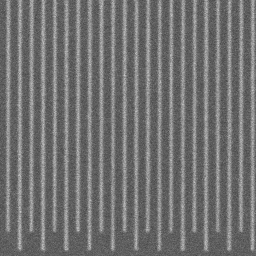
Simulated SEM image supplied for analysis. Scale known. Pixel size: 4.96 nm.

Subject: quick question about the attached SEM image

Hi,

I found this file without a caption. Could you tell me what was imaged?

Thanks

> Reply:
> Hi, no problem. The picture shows parallel lines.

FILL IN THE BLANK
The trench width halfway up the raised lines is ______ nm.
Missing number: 48.4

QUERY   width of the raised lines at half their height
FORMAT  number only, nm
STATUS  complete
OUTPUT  9.9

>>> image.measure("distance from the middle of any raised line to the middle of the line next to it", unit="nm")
57.8